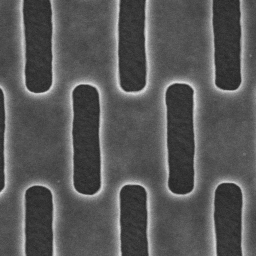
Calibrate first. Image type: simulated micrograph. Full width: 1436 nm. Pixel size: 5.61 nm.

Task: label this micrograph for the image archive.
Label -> holes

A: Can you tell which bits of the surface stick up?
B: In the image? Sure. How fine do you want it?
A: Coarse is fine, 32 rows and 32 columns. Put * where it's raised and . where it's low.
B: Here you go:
***...*********...*********...**
***...*********...*********...**
***...*********...*********...**
***....********...*********...**
***....********...*********...**
***....********...*********...**
***....********...*********...**
***....********...*********...**
***....********...*********...**
***....********...*********...**
***...*********...****.****...**
****..***...****.****...********
.********...*********...********
.********....********...********
.********....********...********
.********...*********...********
.********...*********...********
.********...*********...********
.********....********...********
.********....********...********
.********....********...********
.********....********...********
.********....********...********
****..***...***...***...***...**
***...*********...*********...**
***....********...*********...**
***....********...*********...**
***....********...*********...**
***....********...*********...**
***....********...*********...**
***....********....********...**
***....********....********...**